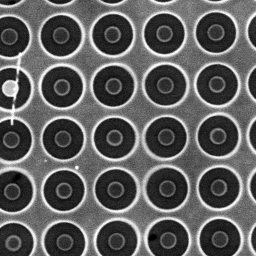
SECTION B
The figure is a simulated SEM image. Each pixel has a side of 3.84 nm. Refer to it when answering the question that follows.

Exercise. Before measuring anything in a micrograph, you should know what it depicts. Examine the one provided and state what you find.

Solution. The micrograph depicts an array of small figures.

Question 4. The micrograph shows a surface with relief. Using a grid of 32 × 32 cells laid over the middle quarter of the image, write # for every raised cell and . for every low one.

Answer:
.#########.....########.....####
...######.......######.......###
....####.........####.........##
....###...........##.....#.....#
#....##....###....##....###....#
#....##....###....##...####....#
#....##....###....##....###....#
.....###.........###..........##
....####.........####.........##
...######.......######.......###
..#########...###########..#####
################################
################################
###########...##########....####
...######.......######.......###
....####.........####.........##
.....###..........##..........##
#....##....###....##....###....#
##...##....###....##....###....#
##...##....###....##....###....#
#....###..........##..........##
....####.........####.........##
...######.......######.......###
..#########....#########...#####
################################
################################
.##########....########......###
...######........####.........##
....#####........####.........##
.....###..........##.....##....#
#....###...####....#....####...#
##...###...####....#....####...#